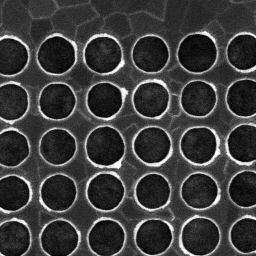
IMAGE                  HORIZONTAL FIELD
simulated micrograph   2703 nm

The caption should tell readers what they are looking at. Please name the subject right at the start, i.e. a regular array of holes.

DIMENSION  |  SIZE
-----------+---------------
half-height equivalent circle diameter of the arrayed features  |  36.7 pixels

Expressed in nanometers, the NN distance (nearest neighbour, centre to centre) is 482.